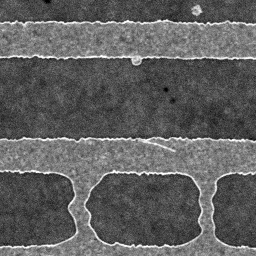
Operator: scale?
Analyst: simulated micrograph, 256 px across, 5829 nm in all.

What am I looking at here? one or a few lines or trenches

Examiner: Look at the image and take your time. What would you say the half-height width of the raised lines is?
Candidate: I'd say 803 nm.